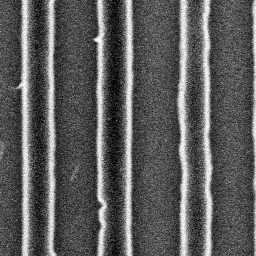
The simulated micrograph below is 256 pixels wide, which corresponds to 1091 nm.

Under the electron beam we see one or a few lines or trenches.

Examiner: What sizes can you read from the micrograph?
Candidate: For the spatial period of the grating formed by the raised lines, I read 0.335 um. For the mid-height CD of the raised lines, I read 119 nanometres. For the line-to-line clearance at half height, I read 0.205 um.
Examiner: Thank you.